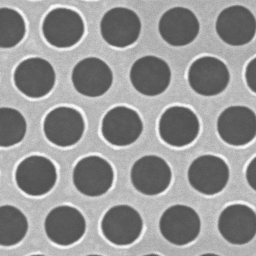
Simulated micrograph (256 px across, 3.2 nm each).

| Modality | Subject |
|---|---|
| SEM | a regular array of holes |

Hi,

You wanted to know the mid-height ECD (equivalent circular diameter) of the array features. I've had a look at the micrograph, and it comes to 127 nm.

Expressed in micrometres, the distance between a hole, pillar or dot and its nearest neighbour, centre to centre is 0.181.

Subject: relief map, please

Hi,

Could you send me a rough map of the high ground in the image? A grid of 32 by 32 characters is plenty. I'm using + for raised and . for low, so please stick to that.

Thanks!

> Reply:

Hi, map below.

++++++++++++++++++++++++++++++++
..++++...++++....++++...++++...+
...+++....+++....+++.....++.....
...++.....+++.....++.....++.....
...+++....+++....+++....+++.....
..++++...+++++..+++++..++++++.++
++++++++++++++++++++++++++++++++
+++...++++...++++...+++++..+++++
++.....++.....++.....+++....+++.
++.....++.....++.....+++.....++.
++.....++.....+++....+++....+++.
+++...++++...++++...+++++...++++
++++++++++++++++++++++++++++++++
.++++++..+++++..+++++..+++++...+
...+++....+++....+++....++++....
...++.....+++.....++.....++.....
...+++....+++.....++.....++.....
...+++....+++....++++...++++...+
++++++++++++++++++++++++++++++++
++++.+++++++++++++.+++++++.+++++
+++....+++....+++....+++....+++.
++.....++.....++.....+++.....++.
++.....++.....++.....+++.....++.
+++...++++....+++....+++....++++
++++++++++++++++++++++++++++++++
++++++++++++++++++++++++++++++++
...+++....+++....++++...++++....
...+++.....++.....++.....++.....
...+++.....++.....++.....++.....
...+++....+++....+++.....+++....
..+++++..+++++..++++++.++++++.++
++++++++++++++++++++++++++++++++